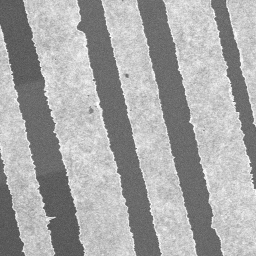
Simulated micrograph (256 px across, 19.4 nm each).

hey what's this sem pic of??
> one or a few lines or trenches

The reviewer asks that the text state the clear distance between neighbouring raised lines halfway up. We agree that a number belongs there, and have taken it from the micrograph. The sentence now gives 514 nanometers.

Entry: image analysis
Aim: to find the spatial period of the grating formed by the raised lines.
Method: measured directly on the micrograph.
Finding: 1300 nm